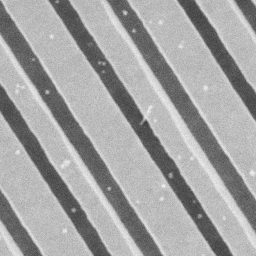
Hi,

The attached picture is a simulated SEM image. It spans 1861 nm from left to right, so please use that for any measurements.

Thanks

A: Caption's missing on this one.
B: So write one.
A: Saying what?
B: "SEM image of lines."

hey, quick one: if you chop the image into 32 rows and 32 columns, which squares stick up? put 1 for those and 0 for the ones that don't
11111100011110001111110001111000
01111110001111000111111001111100
00111111001111000011111100111100
00111111000111100011111100011110
00011111100111110001111110011111
10001111110011111001111111001111
10001111110001111000111111000111
11000111111001111100011111100111
11000111111100111100011111110011
11100011111100011110001111110001
11110001111110011111000111111001
01110001111111001111000111111100
01111000111111000111100011111100
00111100011111100111110001111110
00011100011111100011110001111110
10011110001111110001111000111111
11001111000111111001111000011111
11000111000111111000111100011111
11100111100011111100011110001111
11110011110001111110011110001111
11110011110001111110001111000111
11111001111000111111001111100011
11111100111000111111100111100011
11111100011100011111100011110001
01111110011110001111110001110000
01111110001110001111111001111000
00111111000111000111111000111100
00111111100111100011111100111100
00011111100011100011111110011110
10001111110011110001111110001111
10001111111001111000111111001111
11000111111000111000111111100111